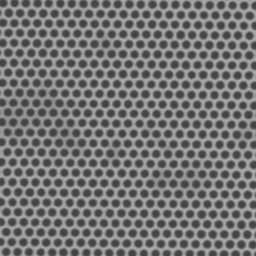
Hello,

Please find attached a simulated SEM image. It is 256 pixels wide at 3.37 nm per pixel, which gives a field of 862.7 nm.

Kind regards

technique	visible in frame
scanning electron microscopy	a regular array of holes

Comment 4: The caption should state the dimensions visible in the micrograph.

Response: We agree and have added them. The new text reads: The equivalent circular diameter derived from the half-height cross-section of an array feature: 27.1 nm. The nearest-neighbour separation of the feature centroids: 0.0374 um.